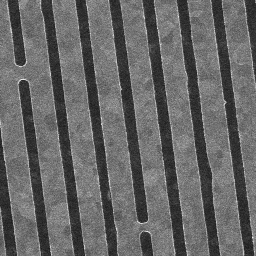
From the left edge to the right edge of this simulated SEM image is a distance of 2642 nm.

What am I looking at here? parallel lines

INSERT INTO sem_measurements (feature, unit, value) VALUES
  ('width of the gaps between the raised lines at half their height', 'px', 10.9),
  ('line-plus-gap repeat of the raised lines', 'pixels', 33.6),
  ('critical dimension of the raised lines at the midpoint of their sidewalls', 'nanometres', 233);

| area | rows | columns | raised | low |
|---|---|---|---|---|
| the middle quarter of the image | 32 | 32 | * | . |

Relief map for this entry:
*****...*****...******...*****..
*****...*****...******...*****..
*****...******...*****...******.
*****...******...*****...******.
*****...******...*****...******.
******..******...*****...******.
******...*****...*****...******.
******...*****...*****....*****.
******...*****...******...*****.
******...*****....*****...*****.
.*****...*****....*****...*****.
.*****...******...*****...*****.
.*****...******...*****...******
.******..******...*****...******
.******..******...*****....*****
.******..******...******...*****
.******...*****...******...*****
.******...******..******...*****
.******...******...*****...*****
..*****...******...*****...*****
..*****...******...*****...*****
..******..******...*****...*****
..******..******...******...****
..******...*****...******...****
..******...*****...******...****
..******...******...*****...****
...*****...******...*****...****
...*****...******...*****...****
...******..******...*****...****
...******..******...*****...****
...******..******...*****...****
...******...*****...******...***